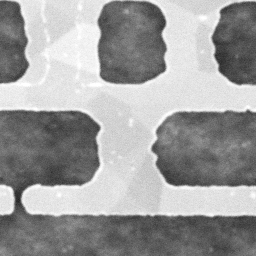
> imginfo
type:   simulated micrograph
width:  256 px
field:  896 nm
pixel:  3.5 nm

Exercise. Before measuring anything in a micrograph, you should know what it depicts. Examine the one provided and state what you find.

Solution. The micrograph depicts one or a few lines or trenches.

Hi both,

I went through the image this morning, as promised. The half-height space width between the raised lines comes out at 267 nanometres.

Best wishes